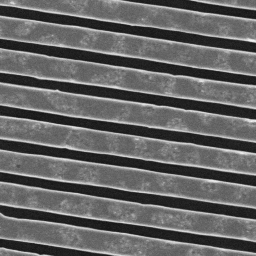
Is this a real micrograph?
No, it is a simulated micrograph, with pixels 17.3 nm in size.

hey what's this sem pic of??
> parallel lines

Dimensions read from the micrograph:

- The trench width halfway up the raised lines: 175 nm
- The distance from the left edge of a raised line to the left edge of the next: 570 nm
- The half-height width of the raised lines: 393 nm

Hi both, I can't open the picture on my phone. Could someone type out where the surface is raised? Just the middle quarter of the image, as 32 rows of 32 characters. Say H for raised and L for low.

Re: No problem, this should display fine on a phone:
HHHHHHHHHHHHLLLLLLLLLLLLLLLLLLLH
HHHHHHHHHHHHHHHHHHHLLLLLLLLLLLLL
HHHHHHHHHHHHHHHHHHHHHHHHHHLLLLLL
HHHHHHHHHHHHHHHHHHHHHHHHHHHHHHHH
LHHHHHHHHHHHHHHHHHHHHHHHHHHHHHHH
LLLLLLLLLHHHHHHHHHHHHHHHHHHHHHHH
LLLLLLLLLLLLLLLLHHHHHHHHHHHHHHHH
HHHLLLLLLLLLLLLLLLLLLLHHHHHHHHHH
HHHHHHHHHHLLLLLLLLLLLLLLLLLLLHHH
HHHHHHHHHHHHHHHHHLLLLLLLLLLLLLLL
HHHHHHHHHHHHHHHHHHHHHHHHHLLLLLLL
HHHHHHHHHHHHHHHHHHHHHHHHHHHHHHLL
HHHHHHHHHHHHHHHHHHHHHHHHHHHHHHHH
LLLLHHHHHHHHHHHHHHHHHHHHHHHHHHHH
LLLLLLLLLLLLLHHHHHHHHHHHHHHHHHHH
HLLLLLLLLLLLLLLLLLLLHHHHHHHHHHHH
HHHHHHHLLLLLLLLLLLLLLLLLLLHHHHHH
HHHHHHHHHHHHHHHLLLLLLLLLLLLLLLLL
HHHHHHHHHHHHHHHHHHHHLLLLLLLLLLLL
HHHHHHHHHHHHHHHHHHHHHHHHHHHLLLLL
HHHHHHHHHHHHHHHHHHHHHHHHHHHHHHHH
LLHHHHHHHHHHHHHHHHHHHHHHHHHHHHHH
LLLLLLLLLLLHHHHHHHHHHHHHHHHHHHHH
LLLLLLLLLLLLLLLLLLHHHHHHHHHHHHHH
HHHHHHLLLLLLLLLLLLLLLLLLHHHHHHHH
HHHHHHHHHHHHHLLLLLLLLLLLLLLLLLLL
HHHHHHHHHHHHHHHHHHHHLLLLLLLLLLLL
HHHHHHHHHHHHHHHHHHHHHHHHHLLLLLLL
HHHHHHHHHHHHHHHHHHHHHHHHHHHHHHHH
HHHHHHHHHHHHHHHHHHHHHHHHHHHHHHHH
LLLLLLLLLHHHHHHHHHHHHHHHHHHHHHHH
LLLLLLLLLLLLLLLHHHHHHHHHHHHHHHHH